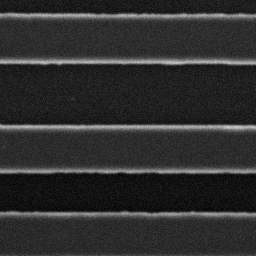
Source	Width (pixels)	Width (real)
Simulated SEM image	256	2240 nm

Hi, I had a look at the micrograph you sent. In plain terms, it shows lines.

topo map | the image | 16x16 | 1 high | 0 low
0000000000000000
1111111111111111
1111111111111111
1111111111111111
0000000000000000
0000000000000000
0000000000000000
0000000000000000
1111111111111111
1111111111111111
1111111111111111
0000000000000000
0000000000000000
1111111111111111
1111111111111111
1111111111111111